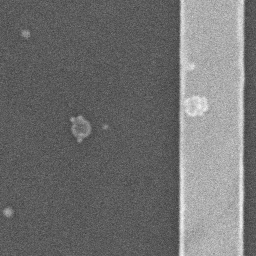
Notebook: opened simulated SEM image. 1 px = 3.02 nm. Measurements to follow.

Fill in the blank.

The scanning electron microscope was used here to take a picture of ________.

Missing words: wiring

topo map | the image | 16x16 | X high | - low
-----------XXXX-
-----------XXXX-
-----------XXXX-
-----------XXXX-
-----------XXXX-
-----------XXXX-
-----------XXXX-
-----------XXXX-
-----------XXXX-
-----------XXXX-
-----------XXXX-
-----------XXXX-
-----------XXXX-
-----------XXXX-
-----------XXXX-
-------------XX-